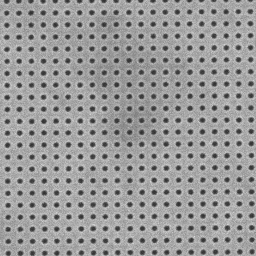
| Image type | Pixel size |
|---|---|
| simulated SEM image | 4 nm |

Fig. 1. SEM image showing a regular array of holes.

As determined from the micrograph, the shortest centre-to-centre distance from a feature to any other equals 47.6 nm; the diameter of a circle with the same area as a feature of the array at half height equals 21.1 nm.